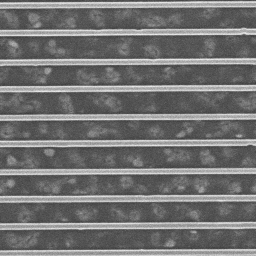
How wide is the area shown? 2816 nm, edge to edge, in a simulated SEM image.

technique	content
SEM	parallel lines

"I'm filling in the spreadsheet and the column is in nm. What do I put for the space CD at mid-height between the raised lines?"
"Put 236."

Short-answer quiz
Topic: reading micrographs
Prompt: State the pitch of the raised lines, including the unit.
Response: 27.6 px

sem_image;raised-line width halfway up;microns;0.0536